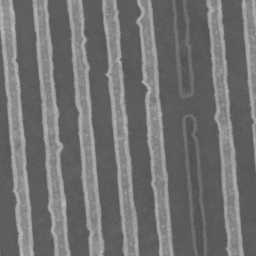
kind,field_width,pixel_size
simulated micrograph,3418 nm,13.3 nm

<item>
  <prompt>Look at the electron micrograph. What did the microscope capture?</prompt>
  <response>parallel lines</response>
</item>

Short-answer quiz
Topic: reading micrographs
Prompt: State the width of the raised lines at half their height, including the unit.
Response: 11.7 px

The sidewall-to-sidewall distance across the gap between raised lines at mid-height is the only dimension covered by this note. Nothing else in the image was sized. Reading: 312 nanometers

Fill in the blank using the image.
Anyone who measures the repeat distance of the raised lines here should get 462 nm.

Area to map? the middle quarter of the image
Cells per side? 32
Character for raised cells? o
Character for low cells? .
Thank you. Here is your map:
...ooo......oo......ooo......oo.
...ooo......oo......ooo......ooo
...ooo.....ooo......ooo......ooo
...ooo.....ooo......ooo......ooo
...ooo......oo......ooo......ooo
...ooo......oo.......oo......ooo
...ooo......oo........o......ooo
...ooo......ooo......oo......ooo
...ooo......oo.......oo.........
...ooo......oo.......ooo........
....oo.......oo......ooo........
....oo......ooo......ooo........
....oo.......oo......ooo........
....ooo......oo......ooo......oo
....ooo......oo......ooo......oo
....ooo......oo......ooo......oo
....ooo......oo......ooo......oo
....ooo......oo......ooo......oo
....ooo......ooo.....ooo......oo
....ooo......oo......ooo.......o
.....oo......oo.......ooo......o
.....oo......ooo......ooo......o
.....oo......ooo......ooo......o
.....oo.......oo......ooo......o
.....oo.......oo......ooo......o
.....ooo......oo......ooo......o
.....ooo......oo......ooo......o
.....ooo......oo......ooo......o
.....ooo......oo......ooo......o
.....ooo......oo......oooo.....o
.....ooo......ooo.....oooo.....o
.....ooo......ooo......oo.......